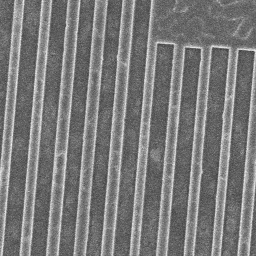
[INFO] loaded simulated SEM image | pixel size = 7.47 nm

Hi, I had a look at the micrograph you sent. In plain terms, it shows parallel lines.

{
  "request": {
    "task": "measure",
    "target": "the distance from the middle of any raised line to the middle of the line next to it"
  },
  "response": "203 nanometers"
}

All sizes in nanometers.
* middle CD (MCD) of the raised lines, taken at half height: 79.1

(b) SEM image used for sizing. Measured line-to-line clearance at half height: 129 nm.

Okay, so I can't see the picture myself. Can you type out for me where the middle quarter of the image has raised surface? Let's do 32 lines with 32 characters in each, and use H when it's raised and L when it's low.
HHHLLLLHHLLLLHHHLLLLLHHLLLLHHHLL
HHHLLLLHHLLLLHHHLLLLLHHLLLLHHHLL
HHLLLLLHHLLLLHHHLLLLLHLLLLLHHHLL
HHLLLLHHHLLLLHHHLLLLHHLLLLLHHLLL
HHLLLLHHHLLLLHHHLLLLHHLLLLLHHLLL
HHLLLLHHHLLLLHHHLLLLHHLLLLLHHLLL
HHLLLLHHHLLLLHHHLLLLHHLLLLLHHLLL
HHLLLLHHHLLLLHHHLLLLHHLLLLLHHLLL
HHLLLLHHHLLLLHHLLLLLHHLLLLLHHLLL
HHLLLLHHHLLLLHHLLLLLHHLLLLHHHLLL
HHLLLLHHHLLLLHHLLLLLHHLLLLHHHLLL
HLLLLHHHLLLLHHHLLLLLHHLLLLHHHLLL
HLLLLHHHLLLLHHHLLLLLHHLLLLHHHLLL
HLLLLHHHLLLLHHHLLLLLHHLLLLHHHLLL
HLLLLHHHLLLLHHHLLLLHHLLLLLHHLLLL
HLLLLHHHLLLLHHHLLLLHHLLLLLHHLLLL
HLLLLHHHLLLLHHHLLLLHHLLLLLHHLLLL
HLLLLHHHLLLLHHHLLLLHHLLLLLHHLLLL
HLLLLHHHLLLLHHHLLLLHHLLLLLHHLLLL
HLLLLHHHLLLLHHHLLLLHHLLLLLHHLLLL
HLLLLHHHLLLLHHLLLLLHHLLLLHHHLLLL
HLLLLHHHLLLLHHLLLLLHHLLLLHHHLLLL
LLLLLHHLLLLLHHLLLLLHHLLLLHHHLLLL
LLLLHHHLLLLHHHLLLLLHHLLLLHHHLLLL
LLLLHHHLLLLHHHLLLLLHHLLLLHHHLLLL
LLLLHHHLLLLHHHLLLLLHHLLLLHHHLLLL
LLLLHHHLLLLHHHLLLLHHLLLLLHHLLLLL
LLLLHHHLLLLHHHLLLLHHLLLLLHHLLLLL
LLLLHHHLLLLHHHLLLLHHLLLLLHHLLLLL
LLLLHHHLLLLHHHLLLLHHLLLLLHHLLLLL
LLLLHHHLLLLHHHLLLLHHLLLLLHHLLLLL
LLLLHHHLLLLHHLLLLLHHLLLLLHHLLLLL